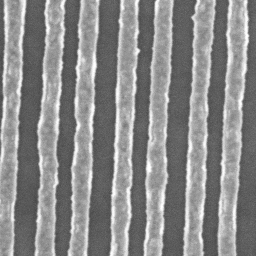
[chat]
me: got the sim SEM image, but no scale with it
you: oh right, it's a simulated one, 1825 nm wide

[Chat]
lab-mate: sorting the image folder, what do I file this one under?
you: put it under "parallel lines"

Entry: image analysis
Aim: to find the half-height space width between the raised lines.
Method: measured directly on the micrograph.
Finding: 136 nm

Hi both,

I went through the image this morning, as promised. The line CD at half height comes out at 124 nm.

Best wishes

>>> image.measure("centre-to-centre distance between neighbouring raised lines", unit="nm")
262